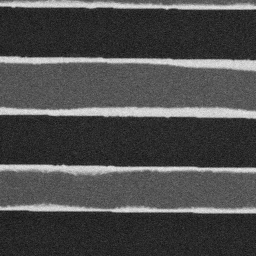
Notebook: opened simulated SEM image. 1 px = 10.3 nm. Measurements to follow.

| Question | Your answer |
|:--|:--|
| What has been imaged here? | lines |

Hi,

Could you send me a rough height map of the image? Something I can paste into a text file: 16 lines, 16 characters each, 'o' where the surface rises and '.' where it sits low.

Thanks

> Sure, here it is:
..............oo
................
................
................
oooooooooooooooo
oooooooooooooooo
oooooooooooooooo
................
................
................
oooooooooo......
oooooooooooooooo
oooooooooooooooo
................
................
................